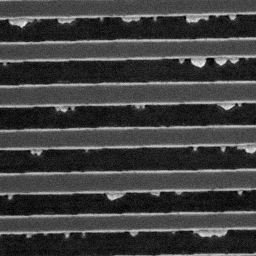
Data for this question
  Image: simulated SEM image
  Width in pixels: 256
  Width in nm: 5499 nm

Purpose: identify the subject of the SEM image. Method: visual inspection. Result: lines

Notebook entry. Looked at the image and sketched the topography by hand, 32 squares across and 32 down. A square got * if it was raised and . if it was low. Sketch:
********************************
********************************
..*.............................
................................
................................
********************************
********************************
*****...................**......
................................
................................
................****************
********************************
********************************
................................
................................
................................
********************************
********************************
**********......................
................................
................................
.....................***********
********************************
********************************
................................
................................
...............................*
********************************
********************************
................................
................................
................................